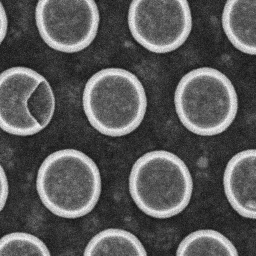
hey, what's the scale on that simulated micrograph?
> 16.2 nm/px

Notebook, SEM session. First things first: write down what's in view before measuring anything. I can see raised bodies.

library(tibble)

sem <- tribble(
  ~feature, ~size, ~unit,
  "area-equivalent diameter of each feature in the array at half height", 966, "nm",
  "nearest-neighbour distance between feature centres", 91.5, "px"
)